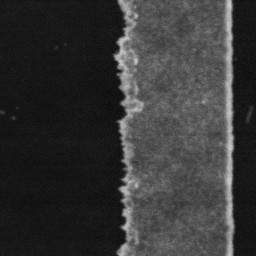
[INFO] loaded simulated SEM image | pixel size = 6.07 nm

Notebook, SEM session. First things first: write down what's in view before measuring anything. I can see one or a few lines or trenches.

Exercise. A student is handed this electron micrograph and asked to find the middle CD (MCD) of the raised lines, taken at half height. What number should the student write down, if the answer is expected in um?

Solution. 0.632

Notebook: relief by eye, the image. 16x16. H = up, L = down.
LLLLLLLLHHHHHHLL
LLLLLLLLHHHHHHLL
LLLLLLLLHHHHHHLL
LLLLLLLHHHHHHHLL
LLLLLLLLHHHHHHLL
LLLLLLLLHHHHHHLL
LLLLLLLLHHHHHHLL
LLLLLLLLHHHHHHLL
LLLLLLLLHHHHHHLL
LLLLLLLLHHHHHHLL
LLLLLLLLHHHHHHLL
LLLLLLLLHHHHHHLL
LLLLLLLLHHHHHHLL
LLLLLLLLHHHHHHLL
LLLLLLLLHHHHHHLL
LLLLLLLLHHHHHHLL